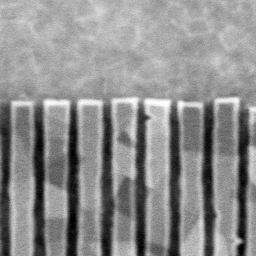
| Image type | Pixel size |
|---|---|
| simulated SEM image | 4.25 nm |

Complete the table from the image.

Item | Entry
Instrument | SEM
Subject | parallel lines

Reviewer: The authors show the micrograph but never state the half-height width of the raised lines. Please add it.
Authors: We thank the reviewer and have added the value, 85.5 nanometers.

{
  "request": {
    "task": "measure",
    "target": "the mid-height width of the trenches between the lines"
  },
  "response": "0.0557 µm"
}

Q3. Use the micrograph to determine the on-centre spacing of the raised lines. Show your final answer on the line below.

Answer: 144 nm